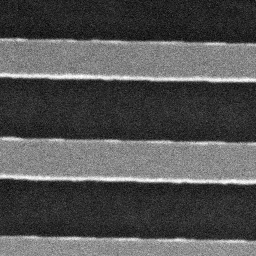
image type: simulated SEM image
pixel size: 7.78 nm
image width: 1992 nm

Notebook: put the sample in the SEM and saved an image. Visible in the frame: lines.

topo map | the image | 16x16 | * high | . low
................
................
**..............
****************
****************
................
................
................
................
****************
****************
................
................
................
................
****************